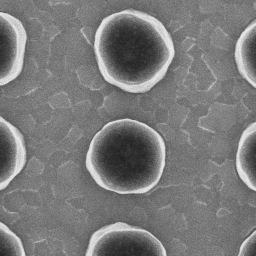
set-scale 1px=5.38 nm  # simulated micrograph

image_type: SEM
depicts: raised bodies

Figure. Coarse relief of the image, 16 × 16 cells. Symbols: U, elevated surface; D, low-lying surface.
DDDDDDDDDDDDDDDD
UDDDDDUUUUDDDDDD
UDDDDDUUUUUDDDDU
UDDDDDUUUUUDDDDU
UDDDDDDUUUDDDDDU
DDDDDDDDUDDDDDDD
DDDDDDDDDDDDDDDD
DDDDDDDUDDDDDDDD
UDDDDDUUUUDDDDDU
UDDDDDUUUUDDDDDU
UDDDDDUUUUDDDDDU
DDDDDDUUUUDDDDDD
DDDDDDDDDDDDDDDD
DDDDDDDDDDDDDDDD
UDDDDDUUUDDDDDDD
UDDDDDUUUUDDDDDU